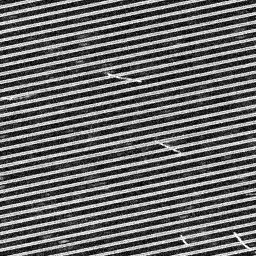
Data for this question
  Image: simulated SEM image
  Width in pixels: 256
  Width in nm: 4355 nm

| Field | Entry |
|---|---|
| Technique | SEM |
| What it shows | parallel lines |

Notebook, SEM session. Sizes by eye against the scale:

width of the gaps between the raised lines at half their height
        102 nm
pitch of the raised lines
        140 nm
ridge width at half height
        43.8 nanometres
